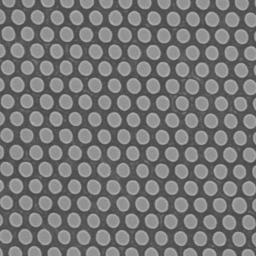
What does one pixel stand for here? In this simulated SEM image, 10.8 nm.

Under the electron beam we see a regular array of raised bodies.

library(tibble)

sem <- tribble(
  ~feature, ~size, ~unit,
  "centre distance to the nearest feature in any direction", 207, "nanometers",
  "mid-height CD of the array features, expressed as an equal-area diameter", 0.152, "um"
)